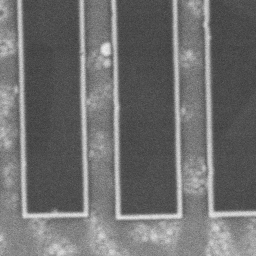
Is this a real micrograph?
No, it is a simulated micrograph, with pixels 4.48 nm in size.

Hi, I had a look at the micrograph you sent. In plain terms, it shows one or a few lines or trenches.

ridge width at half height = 278 nanometers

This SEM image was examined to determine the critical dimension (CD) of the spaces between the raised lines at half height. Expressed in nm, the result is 141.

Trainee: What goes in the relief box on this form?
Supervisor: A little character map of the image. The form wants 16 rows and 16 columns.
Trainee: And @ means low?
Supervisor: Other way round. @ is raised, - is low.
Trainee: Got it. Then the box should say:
-@@@@--@@@@--@@@
-@@@@--@@@@--@@@
-@@@@--@@@@--@@@
-@@@@--@@@@--@@@
-@@@@--@@@@--@@@
-@@@@--@@@@--@@@
-@@@@--@@@@--@@@
-@@@@--@@@@--@@@
-@@@@--@@@@--@@@
-@@@@--@@@@--@@@
-@@@@--@@@@--@@@
-@@@@--@@@@--@@@
-@@@@--@@@@--@@@
--------@@@-----
----------------
----------------